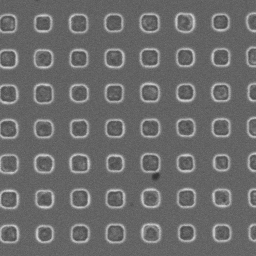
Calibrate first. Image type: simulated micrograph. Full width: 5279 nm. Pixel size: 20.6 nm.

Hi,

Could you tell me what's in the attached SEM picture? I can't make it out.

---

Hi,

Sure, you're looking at a regular array of holes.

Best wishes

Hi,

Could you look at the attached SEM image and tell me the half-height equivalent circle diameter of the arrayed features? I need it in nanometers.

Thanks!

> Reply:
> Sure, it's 354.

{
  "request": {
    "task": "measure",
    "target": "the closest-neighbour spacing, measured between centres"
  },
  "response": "718 nm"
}